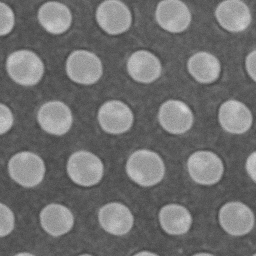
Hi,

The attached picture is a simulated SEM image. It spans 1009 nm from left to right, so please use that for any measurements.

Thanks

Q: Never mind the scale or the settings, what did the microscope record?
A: a regular array of raised bodies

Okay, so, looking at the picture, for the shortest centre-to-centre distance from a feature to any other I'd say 230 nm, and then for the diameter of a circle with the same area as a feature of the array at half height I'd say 135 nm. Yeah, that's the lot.